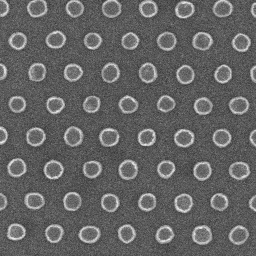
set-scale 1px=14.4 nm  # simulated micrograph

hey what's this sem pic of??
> a regular array of raised bodies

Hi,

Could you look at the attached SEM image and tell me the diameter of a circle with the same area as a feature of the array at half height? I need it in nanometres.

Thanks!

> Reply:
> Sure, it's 254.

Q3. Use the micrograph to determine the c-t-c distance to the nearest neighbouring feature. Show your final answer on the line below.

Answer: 519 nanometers